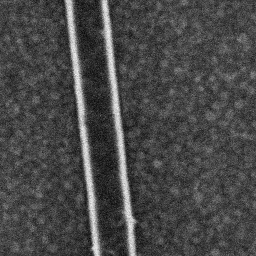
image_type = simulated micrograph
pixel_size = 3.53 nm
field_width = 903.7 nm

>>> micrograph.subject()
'one or a few lines or trenches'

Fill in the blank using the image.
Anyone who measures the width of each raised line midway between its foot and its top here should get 37.4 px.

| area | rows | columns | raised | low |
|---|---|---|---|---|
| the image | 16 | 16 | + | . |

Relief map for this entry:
....+++.........
....+++.........
....+++.........
.....++.........
.....++.........
.....++.........
.....++.........
.....++.........
.....+++........
.....+++........
.....+++........
......++........
......++........
......++........
......++........
......++........